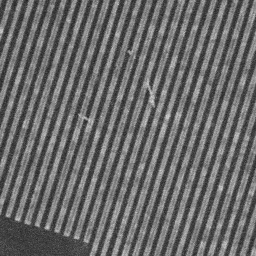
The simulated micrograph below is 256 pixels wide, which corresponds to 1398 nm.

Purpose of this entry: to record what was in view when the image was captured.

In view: parallel lines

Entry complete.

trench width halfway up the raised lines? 39.1 nm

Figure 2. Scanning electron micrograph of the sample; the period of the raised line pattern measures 55.9 nm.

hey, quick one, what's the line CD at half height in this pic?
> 19.5 nm